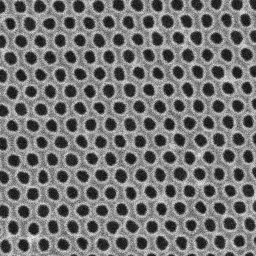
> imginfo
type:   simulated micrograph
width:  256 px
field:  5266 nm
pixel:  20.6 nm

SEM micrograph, a regular array of holes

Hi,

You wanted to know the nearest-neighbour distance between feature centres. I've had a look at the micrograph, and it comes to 388 nm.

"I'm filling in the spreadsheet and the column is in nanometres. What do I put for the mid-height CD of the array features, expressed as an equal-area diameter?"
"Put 265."